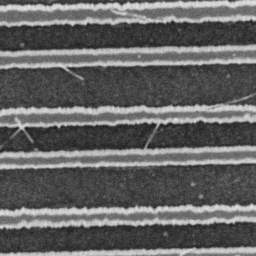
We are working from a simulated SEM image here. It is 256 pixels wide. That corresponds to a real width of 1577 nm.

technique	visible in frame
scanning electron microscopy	lines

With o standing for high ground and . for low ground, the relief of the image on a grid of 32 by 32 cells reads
..................oooooooooooooo
oooooooooooooooooooooooooooooooo
oooooooooooooooooooooooooooooooo
................................
................................
................................
..oooooooooooooooooooooooooooooo
oooooooooooooooooooooooooooooooo
o...............................
................................
................................
................................
................................
.............o..ooo..ooooooooooo
oooooooooooooooooooooooooooooooo
ooooooooooooooo.................
................................
................................
...............................o
oooooooooooooooooooooooooooooooo
ooooooooooooooooooooooooo.......
................................
................................
................................
................................
................................
oooooooooooooooooooooooooooooooo
oooooooooooooooooooooooooooooooo
o...............................
................................
................................
..........oooooooooooooooooooooo